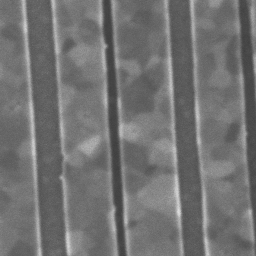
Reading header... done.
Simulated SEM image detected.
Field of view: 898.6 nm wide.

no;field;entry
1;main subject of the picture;one or a few lines or trenches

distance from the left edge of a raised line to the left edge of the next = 240 nanometres